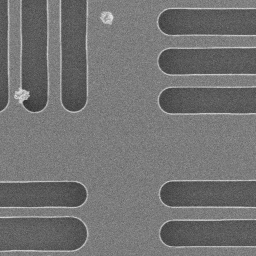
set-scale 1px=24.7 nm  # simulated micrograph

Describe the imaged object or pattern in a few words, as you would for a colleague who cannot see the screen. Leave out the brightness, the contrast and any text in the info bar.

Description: groups of lines, slits or small figures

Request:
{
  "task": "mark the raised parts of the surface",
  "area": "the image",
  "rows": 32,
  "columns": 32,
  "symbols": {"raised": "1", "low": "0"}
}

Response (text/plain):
01100011000111111111111111111111
01100011000111111111000000000000
01100011000111111111000000000000
01100011000111111111000000000000
01100011000111111111111111111111
01100011000111111111111111111111
01100011000111111111000000000000
01100011000111111111000000000000
01100011000111111111000000000000
01100011000111111111111111111111
01100011000111111111111111111111
01100011000111111111000000000000
01100011000111111111000000000000
01100111001111111111000000000000
11111111111111111111111111111111
11111111111111111111111111111111
11111111111111111111111111111111
11111111111111111111111111111111
11111111111111111111111111111111
11111111111111111111111111111111
11111111111111111111111111111111
11111111111111111111111111111111
11111111111111111111111111111111
00000000000111111111000000000000
00000000000111111111000000000000
00000000001111111111100000000000
11111111111111111111111111111111
00000000001111111111110000000000
00000000000111111111000000000000
00000000000111111111000000000000
00000000001111111111100000000000
11111111111111111111111111111111